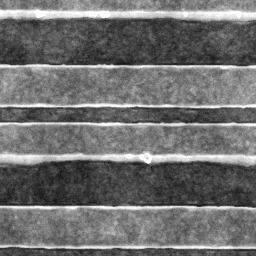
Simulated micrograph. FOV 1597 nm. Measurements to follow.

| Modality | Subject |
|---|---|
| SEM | lines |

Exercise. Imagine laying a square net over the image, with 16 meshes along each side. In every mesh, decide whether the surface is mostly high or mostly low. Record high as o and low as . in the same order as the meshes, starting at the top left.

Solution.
oooooooooooooooo
................
................
................
oooooooooooooooo
oooooooooooooooo
oooooooooooooooo
oooooooooooooooo
oooooooooooooooo
oooooooooooooooo
................
................
................
oooooooooooooooo
oooooooooooooooo
oooooooooooooooo